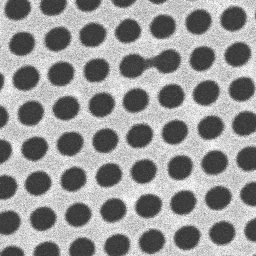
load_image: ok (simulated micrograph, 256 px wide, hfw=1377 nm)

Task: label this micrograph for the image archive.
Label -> a regular array of holes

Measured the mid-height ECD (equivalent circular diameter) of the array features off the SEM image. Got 138 nm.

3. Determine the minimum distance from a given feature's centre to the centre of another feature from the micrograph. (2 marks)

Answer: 0.188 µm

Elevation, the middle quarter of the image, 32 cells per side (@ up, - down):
--@@@------@@@---------------@@@
---@@------@@@------@@@-----@@@@
---@@------@@@------@@@@@-@@@@@@
--@@@-----@@@@@@--@@@@@@@@@@@@@@
--@@@@@-@@@@@@@@@@@@@@@@@@@@@@@@
@@@@@@@@@@@@@@@@@@@@@@@@@----@@@
@@@@@@@@@@@@@@@@@---@@@@------@@
@@@@@@@@---@@@@------@@@------@@
---@@@@-----@@@------@@-------@@
----@@-------@-------@@@------@@
----@@-------@@------@@@-----@@@
----@@------@@@@----@@@@@@@@@@@@
---@@@@-----@@@@@@@@@@@@@@@@@@@@
--@@@@@@@@@@@@@@@@@@@@@@@@@@@@@@
@@@@@@@@@@@@@@@@@@@@@@@@@@----@@
@@@@@@@@@@@@@@@@@----@@@@------@
@@@@@@@@@---@@@@------@@-------@
----@@@@-----@@@------@@-------@
-----@@-------@-------@@@-----@@
-----@@-------@@------@@@----@@@
-----@@------@@@@----@@@@@@@@@@@
----@@@@----@@@@@@@@@@@@@@@@@@@@
---@@@@@@@@@@@@@@@@@@@@@@@@@@@@@
@@@@@@@@@@@@@@@@@@@@@@@@@@@----@
@@@@@@@@@@@@@@@@@@----@@@@------
@@-@@@@@@-----@@@------@@@------
-----@@@------@@@------@@@------
-----@@@-------@@------@@@------
------@@------@@@------@@@@----@
------@@------@@@@---@@@@@@@@@@@
-----@@@@---@@@@@@@@@@@@@@@@@@@@
----@@@@@@@@@@@@@@@@@@@@@@@@@@@@